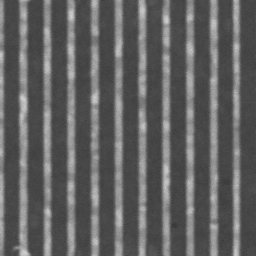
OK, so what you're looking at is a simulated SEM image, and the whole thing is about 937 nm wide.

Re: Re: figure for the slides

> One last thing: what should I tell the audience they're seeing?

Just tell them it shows parallel lines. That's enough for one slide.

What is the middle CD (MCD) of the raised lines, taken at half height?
21.5 nm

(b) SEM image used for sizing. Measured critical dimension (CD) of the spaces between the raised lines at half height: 64.5 nm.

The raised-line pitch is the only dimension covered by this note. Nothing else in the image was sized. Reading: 86.6 nanometers